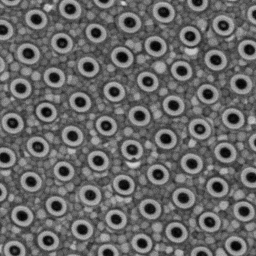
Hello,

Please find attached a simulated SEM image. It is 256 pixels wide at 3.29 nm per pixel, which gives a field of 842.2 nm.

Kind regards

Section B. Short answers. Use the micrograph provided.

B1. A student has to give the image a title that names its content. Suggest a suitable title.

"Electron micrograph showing a regular array of ring-shaped raised bodies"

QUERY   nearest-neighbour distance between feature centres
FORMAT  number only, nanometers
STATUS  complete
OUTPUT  115